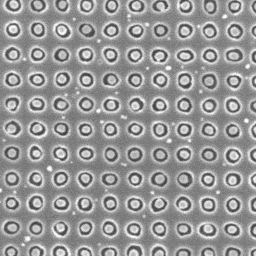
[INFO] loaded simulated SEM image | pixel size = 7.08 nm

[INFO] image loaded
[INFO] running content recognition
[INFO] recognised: a regular array of ring-shaped grooves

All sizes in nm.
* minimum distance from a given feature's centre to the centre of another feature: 167